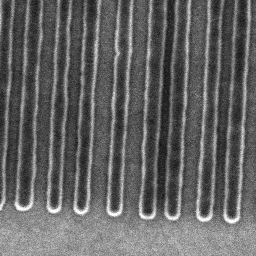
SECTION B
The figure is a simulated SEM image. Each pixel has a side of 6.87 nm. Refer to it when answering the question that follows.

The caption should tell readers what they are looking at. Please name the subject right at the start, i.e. parallel lines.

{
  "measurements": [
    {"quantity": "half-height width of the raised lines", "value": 97.7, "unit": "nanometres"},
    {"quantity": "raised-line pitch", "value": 204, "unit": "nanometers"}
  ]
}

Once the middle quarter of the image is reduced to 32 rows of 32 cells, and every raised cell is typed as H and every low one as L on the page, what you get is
HLLLLHHHLLLLLHHHLLLLLHHHLLLHHHHL
HLLLLHHHLLLLLHHHLLLLLHHHLLLHHHHL
HLLLLHHHLLLLLHHHLLLLLHHHHLLHHHHL
HLLLLHHHLLLLLHHHLLLLLHHHHLLHHHLL
HLLLLHHHLLLLLHHHLLLLLHHHLLLHHHLL
LLLLHHHLLLLLLHHHLLLLLHHHLLLHHHHL
LLLLHHHLLLLLHHHHLLLLLHHHLLLHHHHL
HLLLHHHLLLLLHHHHLLLLHHHHLLLHHHLL
HLLLHHHLLLLLHHHHLLLLHHHHLLLHHHLL
HLLLHHHLLLLLHHHHLLLLLHHHLLLHHHLL
HLLLHHHLLLLLHHHHLLLLHHHHLLLHHHLL
LLLLHHHLLLLLHHHHLLLLHHHHLLLHHHLL
LLLLHHHLLLLLHHHHLLLLHHHHLLLHHHLL
LLLLHHHLLLLLHHHHLLLLHHHHLLLHHHLL
LLLLHHHLLLLLHHHHLLLLHHHHLLLHHHLL
LLLLHHHLLLLLHHHLLLLLHHHHLLHHHHLL
LLLLHHHLLLLLHHHLLLLLHHHHLLHHHHLL
LLLLHHHLLLLLHHHLLLLLHHHHLLHHHHLL
LLLLHHHLLLLLHHHLLLLLHHHHLLHHHHLL
LLLLHHHLLLLLHHHLLLLLHHHLLLHHHHLL
LLLLHHHLLLLLHHHLLLLLHHHLLLHHHHLL
LLLLHHHLLLLLHHHLLLLLHHHLLLHHHHLL
LLLHHHHLLLLLHHHLLLLLHHHLLLHHHHLL
LLLHHHHLLLLLHHHLLLLLHHHLLLHHHHLL
LLLHHHHLLLLLHHHLLLLLHHHLLLHHHHLL
LLLHHHHLLLLHHHHLLLLLHHHLLLHHHHLL
LLLHHHLLLLLHHHHLLLLLHHHLLLHHHLLL
LLLHHHLLLLLHHHHLLLLLHHHLLLHHHLLL
LLLHHHLLLLLHHHLLLLLLHHHLLLHHHLLL
LLLHHHLLLLLHHHHLLLLLHHHLLLHHHLLL
LLLHHHLLLLLHHHHLLLLLHHHLLHHHHLLL
LLLHHHLLLLLHHHHLLLLHHHHLLLHHHLLL